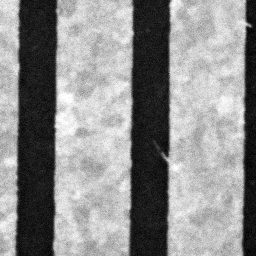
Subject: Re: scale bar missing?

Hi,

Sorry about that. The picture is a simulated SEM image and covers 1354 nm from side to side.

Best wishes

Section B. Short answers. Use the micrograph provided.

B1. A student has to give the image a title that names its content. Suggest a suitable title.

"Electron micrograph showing lines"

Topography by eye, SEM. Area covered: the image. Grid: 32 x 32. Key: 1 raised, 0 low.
11000001111111111000011111111110
11000001111111111000011111111110
11000001111111110000011111111110
11000001111111110000011111111110
11000001111111111000011111111110
11000001111111110000011111111110
11000001111111110000011111111110
11000001111111110000011111111110
11000001111111110000011111111110
11000001111111110000011111111110
11000001111111110000011111111110
11000001111111110000011111111110
11000001111111110000011111111110
11000001111111110000011111111110
11000001111111110000011111111100
11000001111111110000011111111110
11000001111111110000011111111110
11000001111111110000011111111110
11000001111111110000011111111100
11000001111111110000011111111100
11000001111111110000011111111100
11000001111111110000011111111100
11000001111111110000011111111100
11000001111111110000011111111100
11000001111111110000011111111100
11000001111111110000011111111100
11000001111111110000011111111100
11000001111111110000011111111100
11000001111111110000011111111100
11000001111111110000011111111100
11000001111111110000011111111100
11000001111111110000011111111100